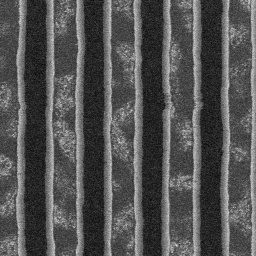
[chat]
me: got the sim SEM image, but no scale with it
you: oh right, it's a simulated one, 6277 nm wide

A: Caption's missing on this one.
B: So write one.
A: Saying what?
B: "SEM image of parallel lines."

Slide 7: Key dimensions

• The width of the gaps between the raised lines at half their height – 641 nanometres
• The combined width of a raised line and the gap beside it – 1430 nm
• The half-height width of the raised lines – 794 nm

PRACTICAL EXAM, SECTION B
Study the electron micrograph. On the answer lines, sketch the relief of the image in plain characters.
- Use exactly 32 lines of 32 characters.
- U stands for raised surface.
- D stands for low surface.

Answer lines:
UUUDDDUUUUDDDUUUUDDDDUUUUDDDUUUU
UUUDDDUUUUDDDUUUUDDDDUUUUDDDUUUU
UUUDDDUUUUDDDUUUUDDDDUUUUDDDUUUU
UUUDDDUUUUDDDUUUUDDDDUUUUDDDUUUU
UUUDDDUUUUDDDUUUUDDDDUUUUDDDUUUU
UUUDDDUUUUDDDUUUUDDDDUUUUDDDUUUU
UUUDDDUUUUDDDUUUUDDDDUUUUDDDUUUU
UUUDDDUUUUDDDUUUUDDDDUUUUDDDUUUU
UUUDDDUUUUDDDUUUUDDDDUUUUDDDUUUU
UUUDDDUUUUDDDUUUUDDDDUUUUDDDUUUU
UUUDDDUUUUDDDUUUUDDDDUUUUDDDUUUU
UUUDDDUUUUDDDUUUUDDDDUUUUDDDUUUU
UUUDDDUUUUDDDUUUUDDDDUUUUDDDUUUU
UUUDDDUUUUDDDUUUUDDDDUUUUDDDUUUU
UUUDDDUUUUDDDUUUUDDDDUUUUDDDUUUU
UUUDDDUUUUDDDUUUUDDDDUUUUDDDUUUU
UUUDDDUUUUDDDUUUUDDDDUUUUDDDUUUU
UUUDDDUUUUDDDUUUUDDDDUUUUDDDUUUU
UUUDDDUUUUDDDUUUUDDDDUUUUDDDUUUU
UUUDDDUUUUDDDUUUUDDDDUUUUDDDUUUU
UUUDDDUUUUDDDUUUUDDDDUUUUDDDUUUU
UUUDDDUUUUDDDUUUUDDDDUUUUDDDUUUU
UUUDDDUUUUDDDUUUUDDDDUUUUDDDUUUU
UUUDDDUUUUDDDUUUUDDDDUUUUDDDUUUU
UUUDDDUUUUDDDUUUUDDDDUUUUDDDUUUU
UUUDDDUUUUDDDUUUUDDDDUUUUDDDUUUU
UUUDDDUUUUDDDUUUUDDDDUUUUDDDUUUU
UUUDDDUUUUDDDUUUUDDDDUUUUDDDUUUU
UUUDDDUUUUDDDUUUUDDDDUUUUDDDUUUU
UUUDDDUUUUDDDUUUUDDDDUUUUDDDUUUU
UUUDDDUUUUDDDUUUUDDDDUUUUDDDUUUU
UUUDDDUUUUDDDUUUUDDDDUUUUDDDUUUU